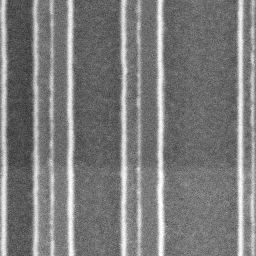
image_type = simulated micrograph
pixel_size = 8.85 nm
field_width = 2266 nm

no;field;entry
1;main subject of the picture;lines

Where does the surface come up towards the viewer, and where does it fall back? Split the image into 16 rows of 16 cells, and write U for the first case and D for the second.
DDUUDDDDUUDDDDDU
DDUUDDDDUUDDDDDU
DDUUDDDDUUDDDDDU
DDUUDDDDUUDDDDDU
DDUUDDDDUUDDDDDU
DDUUDDDDUUDDDDDU
DDUUDDDDUUDDDDDU
DDUUDDDDUUDDDDDU
DDUUDDDDUUDDDDDU
DDUUDDDDUUDDDDDU
DDUUDDDDUUDDDDDU
DDUUDDDDUUDDDDDU
DDUUDDDDUUDDDDDU
DDUUDDDDUUDDDDDU
DDUUDDDDUUDDDDDU
DDUUDDDDUUDDDDDU